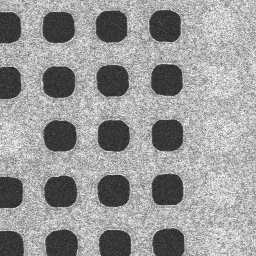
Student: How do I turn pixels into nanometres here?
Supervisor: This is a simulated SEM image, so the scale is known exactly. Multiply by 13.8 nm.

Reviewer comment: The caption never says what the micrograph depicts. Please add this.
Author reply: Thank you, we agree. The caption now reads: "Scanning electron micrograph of a regular array of holes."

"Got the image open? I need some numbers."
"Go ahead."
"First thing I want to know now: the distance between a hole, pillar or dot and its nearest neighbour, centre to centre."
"739 nm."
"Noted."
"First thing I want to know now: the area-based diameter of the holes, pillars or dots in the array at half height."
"465 nm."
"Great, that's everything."